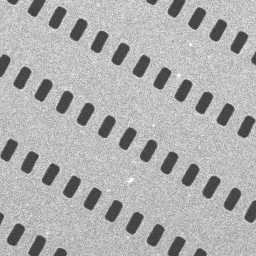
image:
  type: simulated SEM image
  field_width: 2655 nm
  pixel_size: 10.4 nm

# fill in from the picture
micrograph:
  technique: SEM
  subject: a regular array of holes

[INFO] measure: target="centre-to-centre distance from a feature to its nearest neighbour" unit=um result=0.248